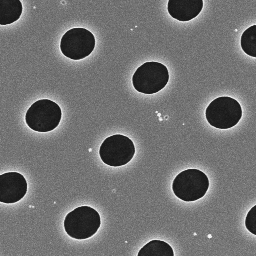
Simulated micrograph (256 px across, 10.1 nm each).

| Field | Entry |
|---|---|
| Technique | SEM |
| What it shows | holes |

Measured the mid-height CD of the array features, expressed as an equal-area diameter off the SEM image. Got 0.345 µm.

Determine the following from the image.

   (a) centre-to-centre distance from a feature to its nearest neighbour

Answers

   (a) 802 nanometers